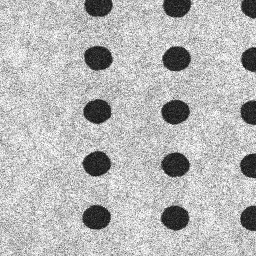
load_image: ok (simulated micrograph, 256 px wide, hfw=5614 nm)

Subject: a regular array of holes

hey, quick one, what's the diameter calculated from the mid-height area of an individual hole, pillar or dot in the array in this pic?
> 579 nm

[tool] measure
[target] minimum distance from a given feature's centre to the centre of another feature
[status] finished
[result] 53 pixels